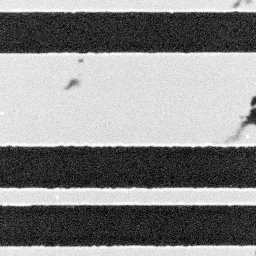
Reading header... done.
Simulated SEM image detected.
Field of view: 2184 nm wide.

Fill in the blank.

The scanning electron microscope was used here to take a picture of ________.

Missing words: lines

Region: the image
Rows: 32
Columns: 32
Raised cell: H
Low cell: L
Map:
HHHHHHHHHHHHHHHHHHHHHHHHHHHHHHHH
LLLLLLLLHHLLLLLLLLLLLHLLLLLLHLLL
LLLLLLLLLLLLLLLLLLLLLLLLLLLLLLLL
LLLLLLLLLLLLLLLLLLLLLLLLLLLLLLLL
LLLLLLLLLLLLLLLLLLLLLLLLLLLLLLLL
LLLLLLLLLLLLLLLLLLLLLLLLLLLLLLLL
LLLLLLLLLLLLLLLLLLLLLLLLLLLLLLLL
HHHHHHHHHHHHHHHHHHHHHHHHHHHHHHHH
HHHHHHHHHHHHHHHHHHHHHHHHHHHHHHHH
HHHHHHHHHHHHHHHHHHHHHHHHHHHHHHHH
HHHHHHHHHHHHHHHHHHHHHHHHHHHHHHHH
HHHHHHHHHHHHHHHHHHHHHHHHHHHHHHHH
HHHHHHHHHHHHHHHHHHHHHHHHHHHHHHHH
HHHHHHHHHHHHHHHHHHHHHHHHHHHHHHHH
HHHHHHHHHHHHHHHHHHHHHHHHHHHHHHHH
HHHHHHHHHHHHHHHHHHHHHHHHHHHHHHHH
HHHHHHHHHHHHHHHHHHHHHHHHHHHHHHHH
HHHHHHHHHHHHHHHHHHHHHHHHHHHHHHHH
LLLLLLLLLLLLLLLLLLLLLLLLLLLLLLLL
LLLLLLLLLLLLLLLLLLLLLLLLLLLLLLLL
LLLLLLLLLLLLLLLLLLLLLLLLLLLLLLLL
LLLLLLLLLLLLLLLLLLLLLLLLLLLLLLLL
LLLLLLLLLLLLLLLLLLLLLLLLLLLLLLLL
LLLLLLLLLLLLLLLLLLLLLLLLLLLLLLLL
HHHHHHHHHHHHHHHHHHHHHHHHHHHHHHHH
HHHHHHHHHHHHHHHHHHHHHHHHHHHHHHHH
LLLLLLLLLLLLLLLLLLLLLLLLLLLLLLLL
LLLLLLLLLLLLLLLLLLLLLLLLLLLLLLLL
LLLLLLLLLLLLLLLLLLLLLLLLLLLLLLLL
LLLLLLLLLLLLLLLLLLLLLLLLLLLLLLLL
LLLLLLLLLLLLLLLLLLLLLLLLLLLLLLLL
HHHHHHHHHHHHHHHHHHHHHHHHHHHHHHHH